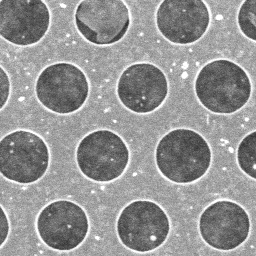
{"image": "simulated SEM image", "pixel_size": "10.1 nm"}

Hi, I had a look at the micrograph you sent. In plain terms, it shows a regular array of holes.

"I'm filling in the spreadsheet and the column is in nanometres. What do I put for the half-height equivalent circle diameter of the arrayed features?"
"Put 526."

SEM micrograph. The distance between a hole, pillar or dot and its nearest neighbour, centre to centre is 0.807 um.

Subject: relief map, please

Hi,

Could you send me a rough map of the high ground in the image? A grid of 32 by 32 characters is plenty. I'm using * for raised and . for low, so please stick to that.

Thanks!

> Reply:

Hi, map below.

......****......****......****..
......****......****......****..
......***.......****......****..
......****......****......****..
.....*****.....*****.....******.
**..********..********.*********
********************************
***************************.****
******....******....*****.....**
.****......****......****......*
.****......****......***.......*
.***.......****......***.......*
.****......****.....*****......*
******....******....******....**
********************************
********************************
**..********..*******...********
.....*****.....*****......****..
......****......****......****..
......***.......***.......****..
......****......****......****..
......****.....*****......*****.
*....*******..*******...********
********************************
********************************
******...*******....*******...**
.****......****......****......*
.****......****......****......*
.****......****......****......*
.****......****......****......*
******....*****.....******....**
*****************.**************